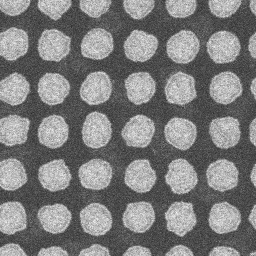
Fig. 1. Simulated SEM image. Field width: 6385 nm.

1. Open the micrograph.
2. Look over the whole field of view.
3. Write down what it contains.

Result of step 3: a regular array of raised bodies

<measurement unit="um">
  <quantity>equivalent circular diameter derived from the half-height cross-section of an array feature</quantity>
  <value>0.762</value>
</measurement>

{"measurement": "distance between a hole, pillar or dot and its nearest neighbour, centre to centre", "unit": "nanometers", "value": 1030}